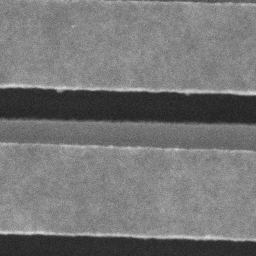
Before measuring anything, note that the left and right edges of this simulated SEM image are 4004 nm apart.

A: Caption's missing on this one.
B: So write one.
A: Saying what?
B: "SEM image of lines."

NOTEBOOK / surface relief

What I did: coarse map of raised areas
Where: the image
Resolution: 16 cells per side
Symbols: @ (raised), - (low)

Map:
@@@@@@@@@@@@@@@@
@@@@@@@@@@@@@@@@
@@@@@@@@@@@@@@@@
@@@@@@@@@@@@@@@@
@@@@@@@@@@@@@@@@
@@@@@@@@@@@@@@@@
----------------
----------------
@@@@@@@@@@@@@@@@
@@@@@@@@@@@@@@@@
@@@@@@@@@@@@@@@@
@@@@@@@@@@@@@@@@
@@@@@@@@@@@@@@@@
@@@@@@@@@@@@@@@@
@@@@@@@@@@@@@@@@
----------------